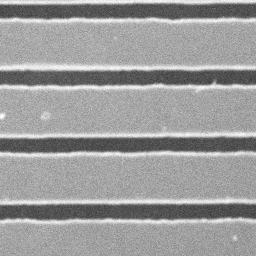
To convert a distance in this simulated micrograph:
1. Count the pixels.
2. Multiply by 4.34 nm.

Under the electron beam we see lines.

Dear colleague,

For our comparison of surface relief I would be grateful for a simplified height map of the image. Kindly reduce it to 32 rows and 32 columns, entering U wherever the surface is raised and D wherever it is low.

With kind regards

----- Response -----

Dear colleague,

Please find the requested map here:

DDDDDDDDDDDDDDDDDDDDDDDDDDDDDDDD
DDDDDDDDDDDDDDDDDDDDDDDDDDDDDDDD
UUUUUUUUUUUUUUUUUUUUUDUUUUUUUUUU
UUUUUUUUUUUUUUUUUUUUUUUUUUUUUUUU
UUUUUUUUUUUUUUUUUUUUUUUUUUUUUUUU
UUUUUUUUUUUUUUUUUUUUUUUUUUUUUUUU
UUUUUUUUUUUUUUUUUUUUUUUUUUUUUUUU
UUUUUUUUUUUUUUUUUUUUUUUUUUUUUUUU
UUUUUUUUUUUUUUUUUUUUUUUUUUUUUUUU
DDDDDDDDDDDDDDDDDDDDDDDDDDDDDDDD
DDDDDDDDDDDDDDDDDDDDDDDDDDDDDDDD
UUUUUUUUUUUUUUUUUUUUUUUUUUUUUUUU
UUUUUUUUUUUUUUUUUUUUUUUUUUUUUUUU
UUUUUUUUUUUUUUUUUUUUUUUUUUUUUUUU
UUUUUUUUUUUUUUUUUUUUUUUUUUUUUUUU
UUUUUUUUUUUUUUUUUUUUUUUUUUUUUUUU
UUUUUUUUUUUUUUUUUUUUUUUUUUUUUUUU
DDDDDDDDDDDDDDDDDDDDDDDDDDDDDDDD
DDDDDDDDDDDDDDDDDDDDDDDDDDDDDDDD
UUUUUUUUUUUUUUUUUUUUUUUUUUUUUUUU
UUUUUUUUUUUUUUUUUUUUUUUUUUUUUUUU
UUUUUUUUUUUUUUUUUUUUUUUUUUUUUUUU
UUUUUUUUUUUUUUUUUUUUUUUUUUUUUUUU
UUUUUUUUUUUUUUUUUUUUUUUUUUUUUUUU
UUUUUUUUUUUUUUUUUUUUUUUUUUUUUUUU
UUDDDDDDDDDDDDDDDDDDDDDDDDDDDDDD
DDDDDDDDDDDDDDDDDDDDDDDDDDDDDDDD
DUUUDDDDDUDDDUDDDDDDDDDDDUDUUUUU
UUUUUUUUUUUUUUUUUUUUUUUUUUUUUUUU
UUUUUUUUUUUUUUUUUUUUUUUUUUUUUUUU
UUUUUUUUUUUUUUUUUUUUUUUUUUUUUUUU
UUUUUUUUUUUUUUUUUUUUUUUUUUUUUUUU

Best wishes